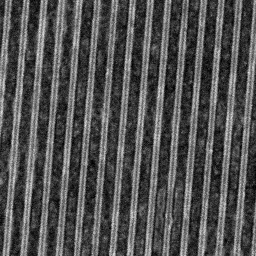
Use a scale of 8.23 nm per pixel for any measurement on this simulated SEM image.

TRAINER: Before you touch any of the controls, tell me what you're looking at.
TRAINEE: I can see parallel lines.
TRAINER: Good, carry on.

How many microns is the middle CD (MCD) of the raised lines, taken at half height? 0.0389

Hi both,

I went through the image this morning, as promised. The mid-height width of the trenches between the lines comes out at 110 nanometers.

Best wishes